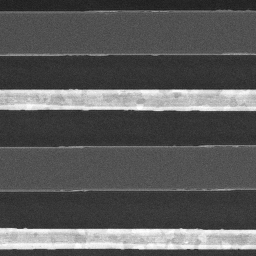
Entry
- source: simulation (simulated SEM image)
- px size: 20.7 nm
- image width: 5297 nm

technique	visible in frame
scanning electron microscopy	lines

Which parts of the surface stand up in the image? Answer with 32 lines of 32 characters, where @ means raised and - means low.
--------------------------------
------------@@@@@@@@@@@@@@@@@@@@
@@@@@@@@@@@@@@@@@@@@@@@@@@@@@@@@
@@@@@@@@@@@@@@@@@@@@@@@@@@@@@@@@
@@@@@@@@@@@@@@@@@@@@@@@@@@@@@@@@
@@@@@@@@@@@@@@@@@@@@@@@@@@@@@@@@
@@@@@@@@@@@@@@@@@@@@@@@@@@@@@@@@
--------------------------------
--------------------------------
--------------------------------
--------------------------------
@@@@@@@@@@@@@@@@@@@@@@@@@@@@----
@@@@@@@@@@@@@@@@@@@@@@@@@@@@@@@@
----------@@@@@@@@@@@@@@@@@@@@@@
--------------------------------
--------------------------------
--------------------------------
--------------------------------
@@@@@@@@@@@@@@@@@@@@@@@@@@@@@@@@
@@@@@@@@@@@@@@@@@@@@@@@@@@@@@@@@
@@@@@@@@@@@@@@@@@@@@@@@@@@@@@@@@
@@@@@@@@@@@@@@@@@@@@@@@@@@@@@@@@
@@@@@@@@@@@@@@@@@@@@@@@@@@@@@@@@
@@@@@@@@@@@@@@@@@@@@@@@@@@@@@@@@
--------------------------------
--------------------------------
--------------------------------
--------------------------------
--------------------------------
@@@@@@@@@@@@@@@@@@@@@@@@@@@@@@@@
@@@@@@@@@@@@@@@@@@@@@@@@@@@@@@@@
--------------------------------